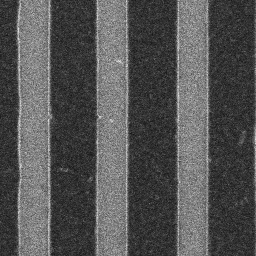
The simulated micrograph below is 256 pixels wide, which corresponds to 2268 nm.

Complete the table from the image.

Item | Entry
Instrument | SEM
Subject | one or a few lines or trenches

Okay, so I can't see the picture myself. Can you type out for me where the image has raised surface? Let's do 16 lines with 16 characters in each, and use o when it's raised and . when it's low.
o..ooo..ooo..ooo
o..ooo..ooo..ooo
o..ooo..ooo..ooo
o..ooo..ooo..ooo
o..ooo..ooo..ooo
o..ooo..ooo..ooo
o..ooo..ooo..ooo
o..ooo..ooo..ooo
o..ooo..ooo..ooo
o..ooo..ooo..ooo
o..ooo..ooo..ooo
o..ooo..ooo..ooo
o..ooo..ooo..ooo
o..ooo..ooo..ooo
o..ooo..ooo..ooo
o..ooo..ooo..ooo